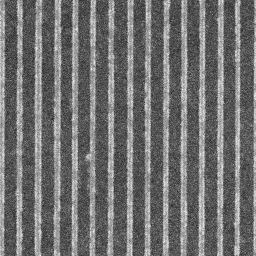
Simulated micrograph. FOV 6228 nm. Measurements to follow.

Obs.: parallel lines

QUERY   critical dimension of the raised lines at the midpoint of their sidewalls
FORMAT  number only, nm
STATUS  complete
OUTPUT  116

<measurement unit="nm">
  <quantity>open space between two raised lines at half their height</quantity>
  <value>325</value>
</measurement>